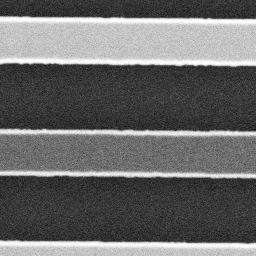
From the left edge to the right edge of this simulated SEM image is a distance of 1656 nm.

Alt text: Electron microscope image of lines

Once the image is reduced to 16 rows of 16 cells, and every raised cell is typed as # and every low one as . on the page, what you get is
................
################
################
################
................
................
................
................
################
################
################
................
................
................
................
################